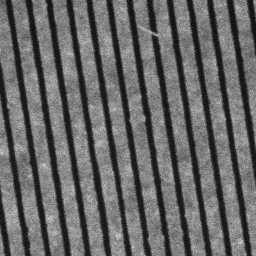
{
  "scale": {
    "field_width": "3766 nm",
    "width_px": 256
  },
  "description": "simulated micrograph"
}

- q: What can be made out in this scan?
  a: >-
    parallel lines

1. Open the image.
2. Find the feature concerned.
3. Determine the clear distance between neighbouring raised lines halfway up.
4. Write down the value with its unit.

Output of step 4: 105 nm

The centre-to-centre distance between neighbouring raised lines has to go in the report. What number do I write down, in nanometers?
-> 293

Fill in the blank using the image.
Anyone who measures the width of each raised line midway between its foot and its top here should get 186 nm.